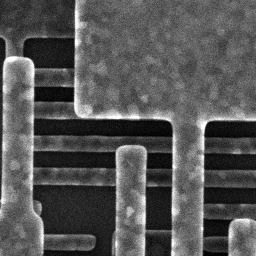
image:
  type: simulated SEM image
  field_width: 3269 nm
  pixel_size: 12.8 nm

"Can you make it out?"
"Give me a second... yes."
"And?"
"wiring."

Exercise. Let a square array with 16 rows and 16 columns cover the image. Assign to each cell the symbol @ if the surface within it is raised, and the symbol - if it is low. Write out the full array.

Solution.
-----@@@@@@@@@@@
-----@@@@@@@@@@@
-----@@@@@@@@@@@
-----@@@@@@@@@@@
@@---@@@@@@@@@@@
@@---@@@@@@@@@@@
@@---@@@@@@@@@@@
@@--------@@@@--
@@---------@@---
@@-----@@--@@---
@@-----@@--@@---
@@-----@@--@@---
@@-----@@--@@---
@@-----@@--@@---
@@@----@@--@@-@@
@@@----@@--@@-@@